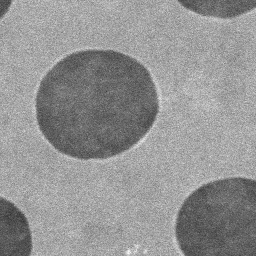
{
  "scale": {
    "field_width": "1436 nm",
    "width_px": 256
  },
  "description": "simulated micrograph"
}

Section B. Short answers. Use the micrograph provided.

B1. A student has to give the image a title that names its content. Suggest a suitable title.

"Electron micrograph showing holes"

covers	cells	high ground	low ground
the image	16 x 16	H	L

LHHHHHHHHHHHLLLL
HHHHHHHHHHHHHHHH
HHHHHHHHHHHHHHHH
HHHHLLLLHHHHHHHH
HHHLLLLLLHHHHHHH
HHLLLLLLLLHHHHHH
HHLLLLLLLLHHHHHH
HHLLLLLLLLHHHHHH
HHHLLLLLLHHHHHHH
HHHHLLLLHHHHHHHH
HHHHHHHHHHHHHHHH
HHHHHHHHHHHHHLLL
HHHHHHHHHHHHLLLL
LLHHHHHHHHHLLLLL
LLHHHHHHHHHLLLLL
LLHHHHHHHHHLLLLL